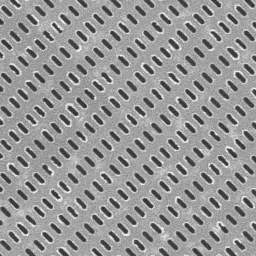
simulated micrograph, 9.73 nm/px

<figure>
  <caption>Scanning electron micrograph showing a regular array of holes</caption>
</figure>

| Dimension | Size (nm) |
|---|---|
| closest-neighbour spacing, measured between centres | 115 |